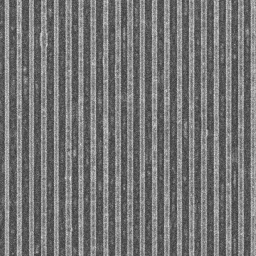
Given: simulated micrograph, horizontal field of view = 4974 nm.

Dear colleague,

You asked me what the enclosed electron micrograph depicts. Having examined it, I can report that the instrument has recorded parallel lines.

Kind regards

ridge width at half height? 4.63 px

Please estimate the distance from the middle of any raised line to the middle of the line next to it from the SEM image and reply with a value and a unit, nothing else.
12.3 px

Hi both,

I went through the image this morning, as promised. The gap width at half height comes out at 143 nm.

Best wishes